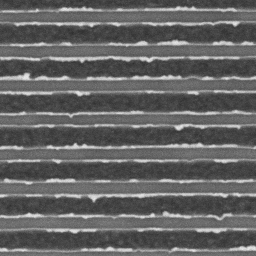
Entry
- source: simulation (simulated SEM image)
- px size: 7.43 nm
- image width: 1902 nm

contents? parallel lines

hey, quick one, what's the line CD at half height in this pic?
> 167 nm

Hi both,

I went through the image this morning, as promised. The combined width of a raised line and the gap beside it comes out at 255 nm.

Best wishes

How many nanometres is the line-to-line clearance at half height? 83.5